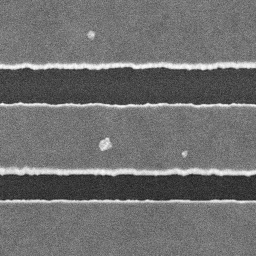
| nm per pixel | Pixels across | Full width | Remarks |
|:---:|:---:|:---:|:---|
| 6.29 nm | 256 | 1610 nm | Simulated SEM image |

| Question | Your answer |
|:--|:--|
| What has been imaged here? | lines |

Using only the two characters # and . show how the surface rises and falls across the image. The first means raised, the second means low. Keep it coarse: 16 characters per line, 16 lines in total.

################
################
################
################
................
................
###.###..###..#.
################
################
################
################
................
................
################
################
################